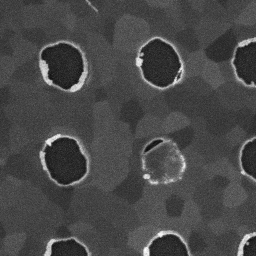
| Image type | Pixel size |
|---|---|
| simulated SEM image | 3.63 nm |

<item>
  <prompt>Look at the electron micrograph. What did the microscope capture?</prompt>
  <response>holes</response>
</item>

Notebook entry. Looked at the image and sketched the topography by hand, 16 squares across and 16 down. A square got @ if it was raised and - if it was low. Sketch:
@@@@@@@@@@@@@@@@
@@@@@@@@@@@@@@@@
@@@@@@@@@@@@@@@@
@@@--@@@@--@@@@-
@@@--@@@@--@@@@-
@@@@@@@@@@@@@@@@
@@@@@@@@@@@@@@@@
@@@@@@@@@@@@@@@@
@@@@@@@@@@@@@@@@
@@@--@@@@@@@@@@-
@@@--@@@@@@@@@@-
@@@@@@@@@@@@@@@@
@@@@@@@@@@@@@@@@
@@@@@@@@@@@@@@@@
@@@@@@@@@@@@@@@@
@@@--@@@@---@@@-